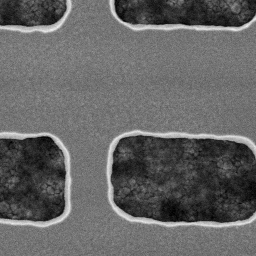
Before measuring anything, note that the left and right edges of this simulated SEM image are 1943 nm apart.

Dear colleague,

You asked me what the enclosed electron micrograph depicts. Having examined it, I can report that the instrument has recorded holes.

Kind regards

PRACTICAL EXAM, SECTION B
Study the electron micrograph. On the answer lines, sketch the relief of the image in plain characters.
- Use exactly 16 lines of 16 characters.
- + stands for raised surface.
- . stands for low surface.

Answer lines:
....+++.........
....++++.......+
++++++++++++++++
++++++++++++++++
++++++++++++++++
++++++++++++++++
++++++++++++++++
++++++++++++++++
.+.+++++...+++++
....+++.........
....+++.........
....+++.........
....+++.........
....++++........
++++++++++++++++
++++++++++++++++